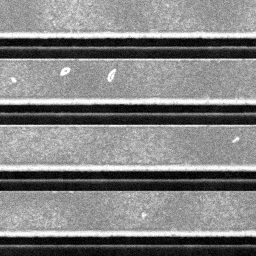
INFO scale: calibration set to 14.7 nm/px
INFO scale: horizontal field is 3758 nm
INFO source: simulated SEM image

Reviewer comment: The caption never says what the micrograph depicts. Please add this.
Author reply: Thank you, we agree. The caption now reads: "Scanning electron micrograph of lines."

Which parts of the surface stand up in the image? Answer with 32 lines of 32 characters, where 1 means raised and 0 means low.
11111111111111111111111111111111
11111111111111111111111111111111
11111111111111111111111111111111
11111111111111111111111111111111
11111111111111111111111111111111
00000000000000000000000000000000
00000000000000000000000000000000
11111111111111111111111111111111
11111111111111111111111111111111
11111111111111111111111111111111
11111111111111111111111111111111
11111111111111111111111111111111
11111111111111111111111111111111
00000000000000000000000000000000
00000000000000000000000000000000
00000000000000000000000000000000
11111111111111111111111111111111
11111111111111111111111111111111
11111111111111111111111111111111
11111111111111111111111111111111
11111111111111111111111111111111
00000000000000000000000000000000
00000000000000000000000000000000
00000000000000000000000000000000
11111111111111111111111111111111
11111111111111111111111111111111
11111111111111111111111111111111
11111111111111111111111111111111
11111111111111111111111111111111
11111111111111111111111111111111
00000000000000000000000000000000
00000000000000000000000000000000